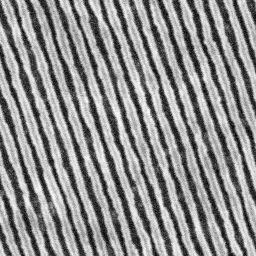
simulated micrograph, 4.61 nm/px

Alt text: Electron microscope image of parallel lines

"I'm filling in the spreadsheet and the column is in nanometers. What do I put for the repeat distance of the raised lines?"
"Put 64.5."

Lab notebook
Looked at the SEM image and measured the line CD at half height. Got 0.0285 um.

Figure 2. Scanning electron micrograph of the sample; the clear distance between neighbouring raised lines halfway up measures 36.6 nm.